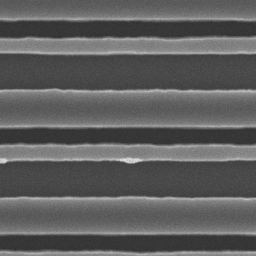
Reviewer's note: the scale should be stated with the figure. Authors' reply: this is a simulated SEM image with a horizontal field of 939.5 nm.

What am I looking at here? lines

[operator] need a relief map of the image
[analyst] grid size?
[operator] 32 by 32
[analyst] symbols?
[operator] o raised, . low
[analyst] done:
oooooooooooooooooooooooooooooooo
oooooooooooooooooooooooooooooooo
.o............................oo
................................
................................
oooooooooooooooooooooooooooooooo
...ooooooooooooooooooooooooooooo
................................
................................
................................
................................
oooooooooooooooooooooooooooooooo
oooooooooooooooooooooooooooooooo
oooooooooooooooooooooooooooooooo
oooooooooooooooooooooooooooooooo
oooooooooooooooooooooooooooooooo
................................
................................
oooooooooooooooooooooooooooooooo
oooooooooooooooooooooooooooooooo
................................
................................
................................
................................
................................
oooooooooooooooooooooooooooooooo
oooooooooooooooooooooooooooooooo
oooooooooooooooooooooooooooooooo
oooooooooooooooooooooooooooooooo
................................
................................
o...............................